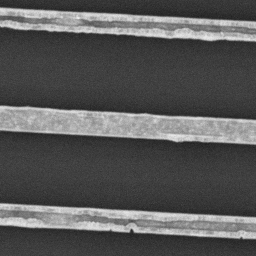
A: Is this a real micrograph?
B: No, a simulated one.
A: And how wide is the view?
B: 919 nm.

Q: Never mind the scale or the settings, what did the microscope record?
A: one or a few lines or trenches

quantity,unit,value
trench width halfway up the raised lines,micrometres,0.272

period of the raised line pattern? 352 nanometers